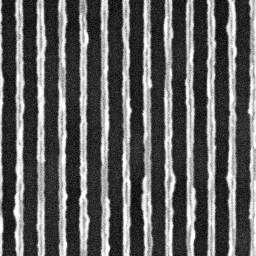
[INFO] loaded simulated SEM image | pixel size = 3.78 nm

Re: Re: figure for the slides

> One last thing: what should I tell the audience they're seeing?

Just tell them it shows parallel lines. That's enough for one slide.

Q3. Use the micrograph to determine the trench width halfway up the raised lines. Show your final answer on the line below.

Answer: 57.7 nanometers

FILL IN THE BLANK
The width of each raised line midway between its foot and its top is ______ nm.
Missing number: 22.7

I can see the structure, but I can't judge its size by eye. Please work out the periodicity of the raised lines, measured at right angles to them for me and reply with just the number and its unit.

0.0804 µm